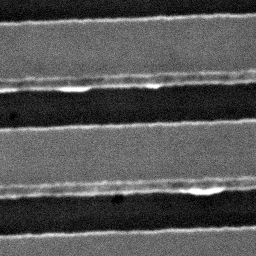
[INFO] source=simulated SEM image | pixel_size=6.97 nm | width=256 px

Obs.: lines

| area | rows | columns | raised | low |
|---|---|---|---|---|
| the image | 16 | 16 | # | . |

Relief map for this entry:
................
################
################
################
################
######..........
................
................
################
################
################
################
................
................
........########
################